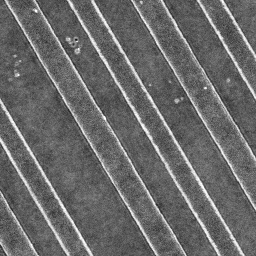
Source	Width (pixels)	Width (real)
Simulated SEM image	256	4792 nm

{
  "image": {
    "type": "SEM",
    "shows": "lines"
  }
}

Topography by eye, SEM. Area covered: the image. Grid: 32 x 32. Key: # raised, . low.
.####....###.....###.....###....
..###....###.....####.....###...
..####....###.....####....###...
...###.....###.....###.....###..
...####....###.....####....###..
....####....###.....###.....###.
....####....###.....####.....###
.....####....###.....####....###
......###.....###.....###.....##
......####....###.....####....##
.......####....###.....###.....#
.......####....###.....####....#
........####....###.....####....
#........###....####....####....
#........####....###.....####...
##........####....###.....###...
##........####....###.....####..
###........####....###.....####.
.###........###....####....####.
.###........####....###.....####
..###........###.....###.....###
..###........####....###.....###
...###........####....###.....##
....###........###....###.....##
....###........####....###.....#
#....###........###.....###.....
##...###........####....###.....
##....###........####....###....
###....###.......####....###....
###....###........####....###...
####....###........###.....###..
.###....###........####....###..